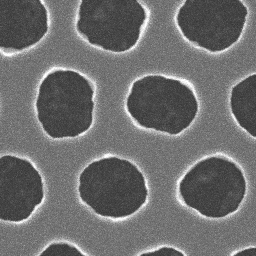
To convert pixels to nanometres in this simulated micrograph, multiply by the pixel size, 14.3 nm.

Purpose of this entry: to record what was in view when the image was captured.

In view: holes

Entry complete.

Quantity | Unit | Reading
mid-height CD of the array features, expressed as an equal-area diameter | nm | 910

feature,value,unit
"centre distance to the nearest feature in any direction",1380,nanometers